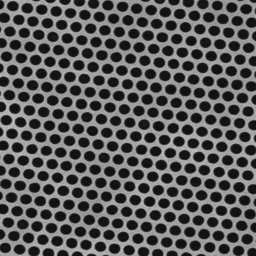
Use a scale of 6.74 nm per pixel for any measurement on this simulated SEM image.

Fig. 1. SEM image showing a regular array of holes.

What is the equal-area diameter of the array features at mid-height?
0.0741 um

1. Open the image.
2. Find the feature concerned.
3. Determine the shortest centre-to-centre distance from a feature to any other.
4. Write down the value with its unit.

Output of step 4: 14.3 px